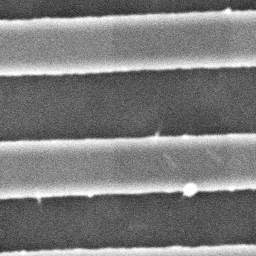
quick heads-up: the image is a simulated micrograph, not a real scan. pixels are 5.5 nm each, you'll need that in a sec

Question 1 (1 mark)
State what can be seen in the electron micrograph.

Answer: lines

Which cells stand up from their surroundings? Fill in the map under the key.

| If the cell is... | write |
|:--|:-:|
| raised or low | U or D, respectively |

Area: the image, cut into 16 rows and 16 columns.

DDDDDDDDDDDDDDDD
UUUUUUUUUUUUUUUU
UUUUUUUUUUUUUUUU
UUUUUUUUUUUUUUUU
UUUUUUUDDDDDDDDD
DDDDDDDDDDDDDDDD
DDDDDDDDDDDDDDDD
DDDDDDDDDDDDDDDD
DDDDDDDDDDDDDUUU
UUUUUUUUUUUUUUUU
UUUUUUUUUUUUUUUU
UUUUUUUUUUUUUUUU
DDDDDDDDDDDDDDDD
DDDDDDDDDDDDDDDD
DDDDDDDDDDDDDDDD
DDDDDDDDDDUUUUUU